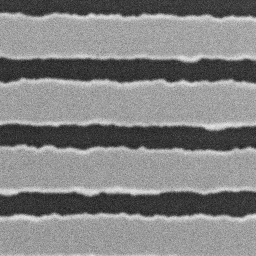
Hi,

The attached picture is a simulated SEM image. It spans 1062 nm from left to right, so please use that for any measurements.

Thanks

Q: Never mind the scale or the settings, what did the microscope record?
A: lines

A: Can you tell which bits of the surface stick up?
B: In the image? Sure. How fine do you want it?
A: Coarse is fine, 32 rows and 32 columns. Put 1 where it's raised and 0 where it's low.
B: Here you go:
00000000000000000000000000000000
00000000000000000000000000000000
11111111111111111111111111111111
11111111111111111111111111111111
11111111111111111111111111111111
11111111111111111111111111111111
11111111111111111111111111111111
00000000000000000000000000000000
00000000000000000000000000000000
00000000000000000000000000000000
11111111111111111111111111111111
11111111111111111111111111111111
11111111111111111111111111111111
11111111111111111111111111111111
11111111111111111111111111111111
00001110001000111111111111111111
00000000000000000000000000000000
00000000000000000000000000000000
10110110000000010000000000000000
11111111111111111111111111111111
11111111111111111111111111111111
11111111111111111111111111111111
11111111111111111111111111111111
11111111111111111111111111111111
00000000000000000000000000000000
00000000000000000000000000000000
00000000000000000000000000000000
11111111111111111111111111111111
11111111111111111111111111111111
11111111111111111111111111111111
11111111111111111111111111111111
11111111111111111111111111111111